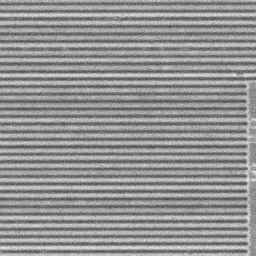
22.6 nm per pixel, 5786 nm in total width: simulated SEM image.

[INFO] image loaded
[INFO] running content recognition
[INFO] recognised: parallel lines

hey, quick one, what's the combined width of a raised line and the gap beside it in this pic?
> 7.49 px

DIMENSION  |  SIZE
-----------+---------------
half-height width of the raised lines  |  65 nm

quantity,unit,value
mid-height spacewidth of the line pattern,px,4.88